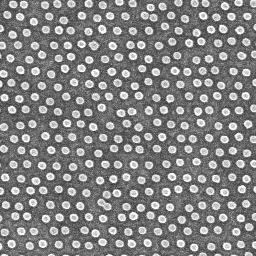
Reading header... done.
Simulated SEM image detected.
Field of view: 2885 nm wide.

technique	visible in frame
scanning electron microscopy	a regular array of raised bodies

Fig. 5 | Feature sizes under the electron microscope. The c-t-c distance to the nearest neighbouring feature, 142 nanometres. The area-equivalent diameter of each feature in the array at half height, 0.0824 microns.